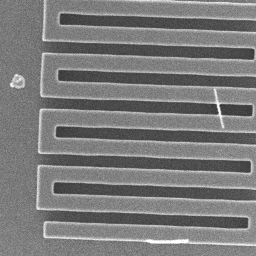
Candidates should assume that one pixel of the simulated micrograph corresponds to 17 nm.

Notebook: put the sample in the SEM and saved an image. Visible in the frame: groups of lines, slits or small figures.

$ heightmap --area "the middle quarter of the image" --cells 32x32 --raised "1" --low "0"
11111111111111111111111111111111
00000011111111111111111111111111
00000000000000000000000000000000
00000000000000000000000000000000
11110000000000000000000000000000
11111111111111111111111111000000
11111111111111111111111111111111
11111111111111111111111111111111
00111111111111111111111111111111
00000000000000000000000000000000
00000000000000000000000000000000
11110000000000000000000000000000
11111111111111111111111111100000
11111111111111111111111111111111
11111111111111111111111111111111
01111111111111111111111111111111
00000000000000000000000000000000
00000000000000000000000000000000
00000000000000000000000000000000
11111111111111111111111100000000
11111111111111111111111111111111
11111111111111111111111111111111
00111111111111111111111111111111
00000000000000000000000000000011
00000000000000000000000000000000
00000000000000000000000000000000
11111111111111111111111000000000
11111111111111111111111111111111
11111111111111111111111111111111
11111111111111111111111111111111
00000000000000000000000000001111
00000000000000000000000000000000